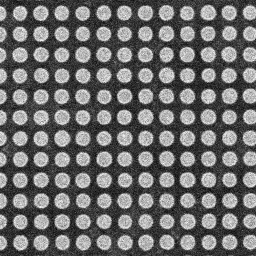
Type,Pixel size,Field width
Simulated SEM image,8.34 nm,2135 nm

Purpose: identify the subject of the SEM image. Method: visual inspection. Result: a regular array of raised bodies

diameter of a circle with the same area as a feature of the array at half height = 120 nm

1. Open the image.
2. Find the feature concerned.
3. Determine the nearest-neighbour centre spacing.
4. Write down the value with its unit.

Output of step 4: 0.172 um